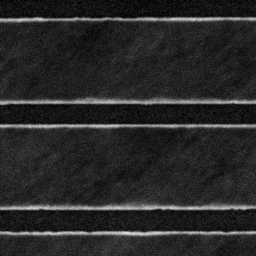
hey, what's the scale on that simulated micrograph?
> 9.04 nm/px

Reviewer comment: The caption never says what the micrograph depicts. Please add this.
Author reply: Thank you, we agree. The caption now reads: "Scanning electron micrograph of lines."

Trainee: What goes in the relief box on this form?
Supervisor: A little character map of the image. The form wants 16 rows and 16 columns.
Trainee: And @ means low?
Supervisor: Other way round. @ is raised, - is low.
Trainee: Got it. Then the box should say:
----------------
@@@@@@@@@@@@@@@@
@@@@@@@@@@@@@@@@
@@@@@@@@@@@@@@@@
@@@@@@@@@@@@@@@@
@@@@@@@@@@@@@@@@
----------------
----------------
@@@@@@@@@@@@@@@@
@@@@@@@@@@@@@@@@
@@@@@@@@@@@@@@@@
@@@@@@@@@@@@@@@@
@@@@@@@@@@@@@@@@
----------------
----------------
@@@@@@@@@@@@@@@@